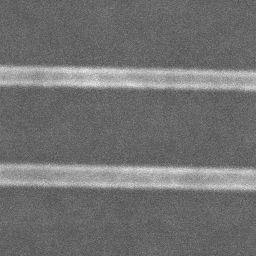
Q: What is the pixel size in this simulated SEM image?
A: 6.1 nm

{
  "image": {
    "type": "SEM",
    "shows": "one or a few lines or trenches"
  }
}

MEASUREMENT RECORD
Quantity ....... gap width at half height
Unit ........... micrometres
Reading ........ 0.51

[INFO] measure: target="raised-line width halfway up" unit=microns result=0.0991